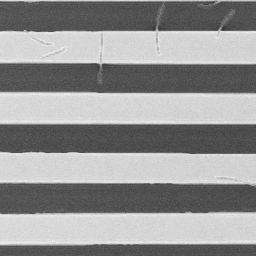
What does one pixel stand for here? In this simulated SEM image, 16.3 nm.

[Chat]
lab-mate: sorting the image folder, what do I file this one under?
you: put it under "lines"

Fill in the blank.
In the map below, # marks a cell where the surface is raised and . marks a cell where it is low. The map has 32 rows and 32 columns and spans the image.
................................
................................
................................
................................
################################
################################
################################
################################
................................
................................
................................
................................
################################
################################
################################
................................
................................
................................
................................
################################
################################
################################
################################
................................
................................
................................
................................
################################
################################
################################
#...............................
................................